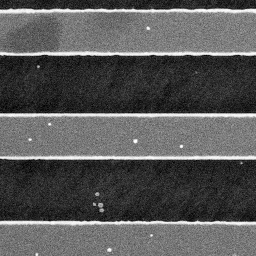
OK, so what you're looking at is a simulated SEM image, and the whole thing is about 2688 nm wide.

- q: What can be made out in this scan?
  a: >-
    lines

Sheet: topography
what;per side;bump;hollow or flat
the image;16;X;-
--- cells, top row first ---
----------------
XXXXXXXXXXXXXXXX
XXXXXXXXXXXXXXXX
----------------
----------------
----------------
----------------
XXXXXXXXXXXXXXXX
XXXXXXXXXXXXXXXX
XXXXXXXXXXXXXXXX
----------------
----------------
----------------
----------------
XXXXXXXXXXXXXXXX
XXXXXXXXXXXXXXXX